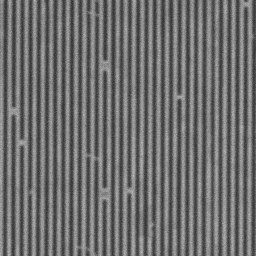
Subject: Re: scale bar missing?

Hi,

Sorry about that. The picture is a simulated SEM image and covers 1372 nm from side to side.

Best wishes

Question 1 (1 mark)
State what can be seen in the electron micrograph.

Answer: parallel lines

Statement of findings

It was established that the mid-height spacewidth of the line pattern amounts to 4.87 px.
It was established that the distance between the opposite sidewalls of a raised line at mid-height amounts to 18.8 nanometers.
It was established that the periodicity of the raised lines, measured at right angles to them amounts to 8.28 px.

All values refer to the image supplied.